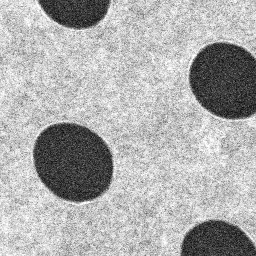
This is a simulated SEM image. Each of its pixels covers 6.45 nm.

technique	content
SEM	holes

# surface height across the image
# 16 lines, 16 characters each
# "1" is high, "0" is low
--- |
1110000111111111
1111001111111111
1111111111111111
1111111111110000
1111111111110000
1111111111110000
1111111111111000
1111111111111111
1100001111111111
1100000111111111
1100000111111111
1110000111111111
1111001111111111
1111111111111111
1111111111110001
1111111111100000